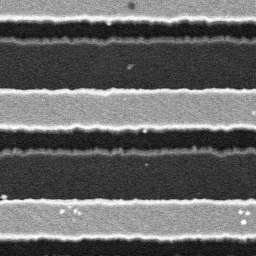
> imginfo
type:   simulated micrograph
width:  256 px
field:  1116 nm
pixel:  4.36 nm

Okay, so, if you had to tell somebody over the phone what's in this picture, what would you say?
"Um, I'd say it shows lines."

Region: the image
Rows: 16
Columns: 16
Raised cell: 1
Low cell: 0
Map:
1111111111111111
0000000000000000
0000000000000000
0000000000000000
0000000000000000
0000000000000000
1111111111111111
1111111111111111
0000000000000000
0000000000000000
0000000000000000
0000000000000000
1111111111111111
1111111111111111
1111111111111111
0000000000000000